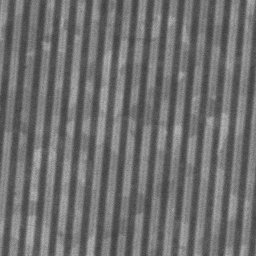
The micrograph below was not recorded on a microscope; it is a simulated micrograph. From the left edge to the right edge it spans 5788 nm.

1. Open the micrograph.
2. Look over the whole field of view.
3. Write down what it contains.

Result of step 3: parallel lines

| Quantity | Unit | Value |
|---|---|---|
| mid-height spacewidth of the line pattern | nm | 217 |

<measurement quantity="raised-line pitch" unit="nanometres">347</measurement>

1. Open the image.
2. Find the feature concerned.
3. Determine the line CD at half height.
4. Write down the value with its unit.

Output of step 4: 132 nm